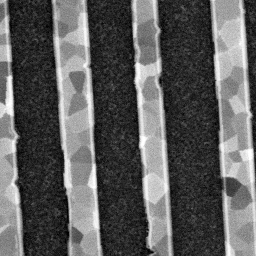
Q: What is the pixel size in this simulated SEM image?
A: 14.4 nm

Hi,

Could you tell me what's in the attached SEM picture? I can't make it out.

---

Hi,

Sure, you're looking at one or a few lines or trenches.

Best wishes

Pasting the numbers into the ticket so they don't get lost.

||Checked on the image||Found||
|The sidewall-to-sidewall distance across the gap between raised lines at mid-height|753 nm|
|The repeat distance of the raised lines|1.13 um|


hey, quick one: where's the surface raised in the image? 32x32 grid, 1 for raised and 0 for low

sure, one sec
10000001110000000110000000011100
10000001110000000110000000011100
10000001111000000110000000011100
10000001111000000111000000011100
10000001111000000111000000011100
10000001111000000111000000011100
10000001111000000111000000011100
10000001111000000111000000011100
10000001111000000111000000011110
10000000111000000111000000011110
10000000111000000111000000011110
10000000111000000111000000011110
10000000111000000011000000001110
10000000111000000011000000001110
10000000111000000011000000001110
10000000111000000011000000001110
11000000111000000011000000001110
11000000111000000011000000001110
11000000111000000011000000001110
11000000111000000011000000001110
11000000111100000011100000001110
11000000111100000011100000001110
11000000111100000011100000001111
11000000111100000011100000001111
11000000011100000011100000001111
11000000011100000011100000001111
11000000011100000001100000001111
11000000011100000001100000001111
11000000011100000001100000001111
11000000011100000001100000000111
11100000011100000001100000000111
11100000011100000001100000000111